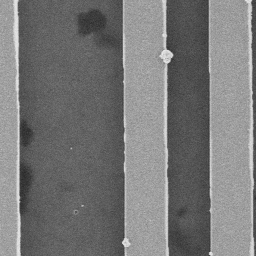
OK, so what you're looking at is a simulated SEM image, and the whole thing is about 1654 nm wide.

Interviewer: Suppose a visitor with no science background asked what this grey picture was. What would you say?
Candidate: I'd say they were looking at lines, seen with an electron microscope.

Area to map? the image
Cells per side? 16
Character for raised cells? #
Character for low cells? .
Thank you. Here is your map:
#.......##...###
#.......##...###
#.......##...###
#.......###..###
#.......##...###
#.......##...###
#.......##...###
#.......##...###
#.......##...###
#.......##...###
#.......##...###
#.......##...###
#.......##...###
#.......##...###
#.......##...###
#.......##...###